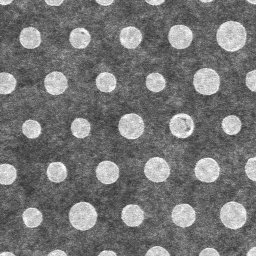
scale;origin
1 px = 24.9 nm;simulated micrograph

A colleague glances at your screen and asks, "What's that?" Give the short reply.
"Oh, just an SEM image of a regular array of raised bodies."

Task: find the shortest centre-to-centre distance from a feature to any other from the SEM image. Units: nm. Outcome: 1230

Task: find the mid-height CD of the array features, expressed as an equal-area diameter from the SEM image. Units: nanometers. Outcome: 531